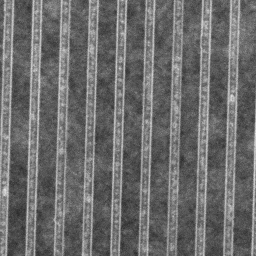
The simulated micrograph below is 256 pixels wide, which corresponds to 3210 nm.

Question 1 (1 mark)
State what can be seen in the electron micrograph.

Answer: parallel lines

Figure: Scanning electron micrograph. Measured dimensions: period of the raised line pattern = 354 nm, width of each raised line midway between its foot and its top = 0.107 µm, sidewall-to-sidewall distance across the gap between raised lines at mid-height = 0.248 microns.